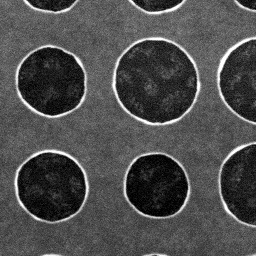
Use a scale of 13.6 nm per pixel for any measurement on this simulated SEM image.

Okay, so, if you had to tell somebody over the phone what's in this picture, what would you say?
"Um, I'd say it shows holes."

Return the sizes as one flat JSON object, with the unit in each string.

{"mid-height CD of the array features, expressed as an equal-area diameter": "942 nm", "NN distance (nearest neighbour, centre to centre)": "1420 nm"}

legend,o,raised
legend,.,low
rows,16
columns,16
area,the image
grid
oo..ooooo..oooo.
oooooooooooooooo
ooooooooo.oooooo
oo..oooo....oo..
o....oo.....oo..
o....oo.....oo..
oo...ooo....oo..
ooooooooo..oooo.
oooooooooooooooo
ooooooooooooooo.
o....ooo...ooo..
o....ooo....oo..
o....ooo....oo..
oo..ooooooooooo.
oooooooooooooooo
oooooooooooooooo